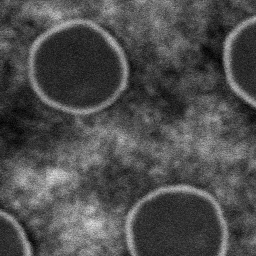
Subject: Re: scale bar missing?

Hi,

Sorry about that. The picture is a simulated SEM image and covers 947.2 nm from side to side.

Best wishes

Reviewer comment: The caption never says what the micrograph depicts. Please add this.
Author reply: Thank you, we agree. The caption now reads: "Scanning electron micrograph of raised bodies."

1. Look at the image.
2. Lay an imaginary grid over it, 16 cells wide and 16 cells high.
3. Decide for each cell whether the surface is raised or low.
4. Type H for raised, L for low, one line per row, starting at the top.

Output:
LLLLLLLLLLLLLLLL
LLLLHHLLLLLLLLLH
LLHHHHHLLLLLLLHH
LLHHHHHHLLLLLLHH
LLHHHHHHLLLLLLHH
LLHHHHHHLLLLLLLH
LLLHHHHLLLLLLLLL
LLLLLLLLLLLLLLLL
LLLLLLLLLLLLLLLL
LLLLLLLLLLLLLLLL
LLLLLLLLLLLLLLLL
LLLLLLLLLLLLLLLL
LLLLLLLLLHHHHLLL
HLLLLLLLHHHHHHLL
HLLLLLLLHHHHHHLL
HHLLLLLLHHHHHHLL